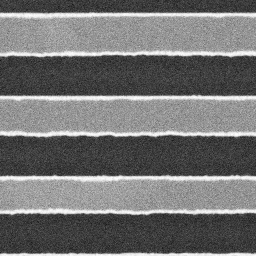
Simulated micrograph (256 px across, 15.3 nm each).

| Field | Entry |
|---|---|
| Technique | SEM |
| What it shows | lines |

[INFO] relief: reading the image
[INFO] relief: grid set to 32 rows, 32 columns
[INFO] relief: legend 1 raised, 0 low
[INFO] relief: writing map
00000000000000000000000000000000
00000000000000000000000000000000
11111111111111111111111111111111
11111111111111111111111111111111
11111111111111111111111111111111
11111111111111111111111111111111
11111111111111111111111111111111
00000000000000000000000000000000
00000000000000000000000000000000
00000000000000000000000000000000
00000000000000000000000000000000
00000000000000000000000000000000
11111111111111111111111111111111
11111111111111111111111111111111
11111111111111111111111111111111
11111111111111111111111111111111
11111111111111111111111111111111
00000000000000000000000000000000
00000000000000000000000000000000
00000000000000000000000000000000
00000000000000000000000000000000
00000000000000000000000000000000
11111111111111111111111111111111
11111111111111111111111111111111
11111111111111111111111111111111
11111111111111111111111111111111
11111111111111111111111111111111
00000000000000000000000000000000
00000000000000000000000000000000
00000000000000000000000000000000
00000000000000000000000000000000
00000000000000000000000000000000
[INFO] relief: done